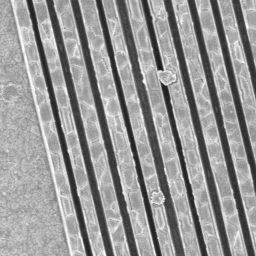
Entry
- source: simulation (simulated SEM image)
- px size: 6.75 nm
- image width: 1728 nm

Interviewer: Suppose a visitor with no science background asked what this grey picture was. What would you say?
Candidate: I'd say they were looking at parallel lines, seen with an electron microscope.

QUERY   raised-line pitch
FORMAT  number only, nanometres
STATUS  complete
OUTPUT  151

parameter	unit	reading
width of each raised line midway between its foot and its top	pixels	15.9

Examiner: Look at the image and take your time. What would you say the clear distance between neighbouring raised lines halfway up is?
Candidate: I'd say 45.1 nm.